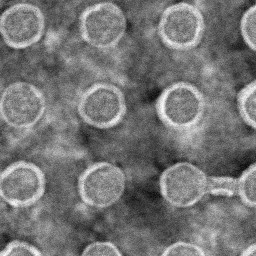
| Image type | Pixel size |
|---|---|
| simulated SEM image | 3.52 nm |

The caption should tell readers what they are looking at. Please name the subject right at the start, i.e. raised bodies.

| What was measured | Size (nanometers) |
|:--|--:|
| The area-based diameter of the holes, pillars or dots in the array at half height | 159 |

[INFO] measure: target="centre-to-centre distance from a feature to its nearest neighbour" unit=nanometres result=276